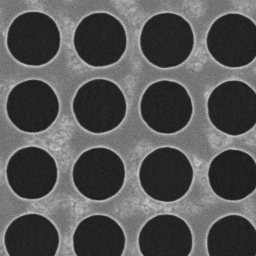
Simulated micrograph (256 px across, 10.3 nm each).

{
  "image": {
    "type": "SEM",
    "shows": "a regular array of holes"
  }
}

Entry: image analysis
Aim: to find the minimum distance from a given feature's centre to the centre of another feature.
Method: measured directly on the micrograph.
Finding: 683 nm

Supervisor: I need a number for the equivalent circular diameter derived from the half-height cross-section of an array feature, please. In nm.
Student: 551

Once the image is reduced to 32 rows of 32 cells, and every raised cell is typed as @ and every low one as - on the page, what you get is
@@@@@@@@@@@@@@@@@@@@@@@@@@@@@@@@
@@@@-@@@@@@@@@@@@@@@@@@@@@@@@@@@
@@-----@@@-----@@@@----@@@@----@
@------@@@-----@@@------@@------
@-------@-------@@------@@------
@-------@-------@@------@@------
@------@@@------@@------@@------
@@----@@@@-----@@@-----@@@@-----
@@@@@@@@@@@@@@@@@@@@-@@@@@@@@@@@
@@@@@@@@@@@@@@@@@@@@@@@@@@@@@@@@
@@----@@@@@---@@@@@---@@@@@@---@
@------@@@-----@@@-----@@@@-----
@------@@-------@@------@@------
@------@@-------@-------@@------
@------@@-------@@------@@------
@@----@@@@-----@@@-----@@@@-----
@@@--@@@@@@--@@@@@@@--@@@@@@---@
@@@@@@@@@@@@@@@@@@@@@@@@@@@@@@@@
@@@--@@@@@@@-@@@@@@@--@@@@@@@@@@
@@----@@@@-----@@@-----@@@@----@
@------@@------@@@------@@------
@------@@-------@-------@@------
@------@@-------@-------@@------
@------@@@-----@@@------@@------
@@----@@@@@---@@@@@----@@@@----@
@@@@@@@@@@@@@@@@@@@@@@@@@@@@@@@@
@@@@@@@@@@@@@@@@@@@@@@@@@@@@@@@@
@@----@@@@----@@@@@----@@@@----@
@------@@@-----@@@------@@------
@------@@-------@-------@@------
@------@@-------@-------@@------
@------@@------@@@------@@------